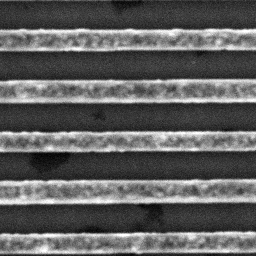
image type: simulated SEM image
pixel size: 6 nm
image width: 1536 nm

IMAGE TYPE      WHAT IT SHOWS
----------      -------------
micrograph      lines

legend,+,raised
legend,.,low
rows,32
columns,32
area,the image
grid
................................
................................
................................
................................
++++++++++++++++++++++++++++++++
++++++++++++++++++++++++++++++++
................................
................................
................................
................................
++++++++++++++++++++++++++++++++
++++++++++++++++++++++++++++++++
+++++...++++++++++++++++++++++++
................................
................................
................................
................................
++++++++++++++++++++++++++++++++
++++++++++++++++++++++++++++++++
................................
................................
................................
................................
++++++++++++++++++++++++++++++++
++++++++++++++++++++++++++++++++
................................
................................
................................
................................
++++++++++++++++++++++++++++++++
++++++++++++++++++++++++++++++++
++++++++++++++++++++++++++++++++